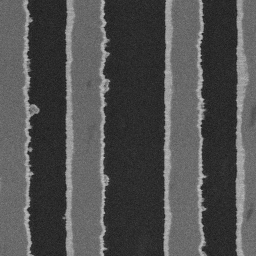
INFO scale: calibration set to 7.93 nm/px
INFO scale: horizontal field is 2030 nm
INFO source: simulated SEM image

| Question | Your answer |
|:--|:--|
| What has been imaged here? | lines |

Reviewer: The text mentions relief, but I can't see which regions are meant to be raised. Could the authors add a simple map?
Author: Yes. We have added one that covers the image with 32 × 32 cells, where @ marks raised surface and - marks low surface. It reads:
@@@------@@@@--------@@@@-----@@
@@@@-----@@@@--------@@@@-----@@
@@@@-----@@@@--------@@@@-----@@
@@@-----@@@@@--------@@@@-----@@
@@@-----@@@@@--------@@@@-----@@
@@@@----@@@@@--------@@@@-----@@
@@@-----@@@@@--------@@@@-----@@
@@@------@@@@--------@@@@-----@@
@@@-----@@@@@--------@@@@-----@@
@@@@----@@@@@--------@@@@-----@@
@@@@----@@@@@--------@@@@-----@@
@@@------@@@@--------@@@@-----@@
@@@@-----@@@@--------@@@@-----@@
@@@@-----@@@@--------@@@@-----@@
@@@@----@@@@@--------@@@@-----@@
@@@@-----@@@@--------@@@@-----@@
@@@@-----@@@@--------@@@@-----@@
@@@@-----@@@@--------@@@@-----@@
@@@------@@@@--------@@@@-----@@
@@@@-----@@@@--------@@@@-----@@
@@@@----@@@@@--------@@@@-----@@
@@@@----@@@@@--------@@@@-----@@
@@@@----@@@@@--------@@@@-----@@
@@@@-----@@@@--------@@@@-----@@
@@@@-----@@@@--------@@@@-----@@
@@@@-----@@@@--------@@@@-----@@
@@@@----@@@@@--------@@@@-----@@
@@@@----@@@@@--------@@@@-----@@
@@@@-----@@@@--------@@@@-----@@
@@@@-----@@@@--------@@@@-----@@
@@@@-----@@@@--------@@@@-----@@
@@@@-----@@@@--------@@@@-----@@